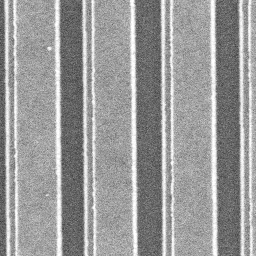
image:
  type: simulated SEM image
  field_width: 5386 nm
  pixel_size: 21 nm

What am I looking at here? lines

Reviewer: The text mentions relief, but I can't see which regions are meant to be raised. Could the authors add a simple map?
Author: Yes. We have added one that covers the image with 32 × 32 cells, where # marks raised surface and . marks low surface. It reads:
.######....######...#######...##
.######....######....######...##
.######....######....######...##
.######....######....######...##
.######....######....######...##
.######....######....######...##
.######....######....######...##
.######....######....######...##
.######....######....######...##
.######....######....######...##
.######....######....######...##
.######....######....######...##
.######....######....######...##
.######....######....######...##
.######....######....######...##
.######....######....######...##
.######....######....######...##
.######....######....######...##
.######....######....######...##
.######....######....######...##
.######....######....######...##
.######....######....######...##
.######....######....######...##
.######....######....######...##
.######....######....######...##
.######....######....######...##
.######....######....######...##
.######....######....######...##
.######....######....######...##
.######....######....######...##
.######....######....######...##
.######....######....######...##